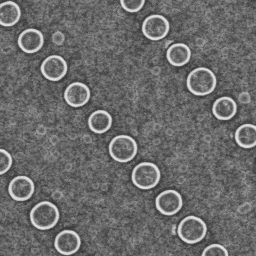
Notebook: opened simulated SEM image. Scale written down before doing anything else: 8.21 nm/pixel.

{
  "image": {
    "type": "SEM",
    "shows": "a regular array of raised bodies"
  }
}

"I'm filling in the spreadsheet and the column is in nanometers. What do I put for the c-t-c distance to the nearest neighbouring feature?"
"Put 290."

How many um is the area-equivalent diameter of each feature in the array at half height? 0.193